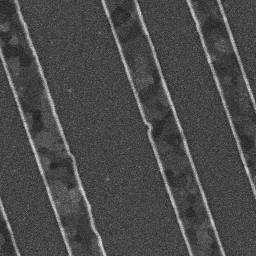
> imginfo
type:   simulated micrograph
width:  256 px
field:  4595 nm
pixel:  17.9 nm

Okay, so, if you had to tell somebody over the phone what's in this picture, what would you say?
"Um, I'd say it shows one or a few lines or trenches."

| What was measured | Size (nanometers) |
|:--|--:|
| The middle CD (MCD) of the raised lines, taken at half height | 557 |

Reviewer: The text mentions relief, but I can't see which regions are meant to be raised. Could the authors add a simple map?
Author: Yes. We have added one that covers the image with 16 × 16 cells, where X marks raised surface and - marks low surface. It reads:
X------XX---XX--
X------XX---XX--
XX-----XX----XX-
XX------XX---XX-
XXX-----XX---XX-
-XX-----XX----XX
-XX------XX---XX
-XXX-----XX---XX
--XX-----XX----X
--XX------XX---X
---XX-----XX---X
---XX-----XX----
---XX------XX---
----XX-----XX---
X---XX-----XX---
X---XX------XX--